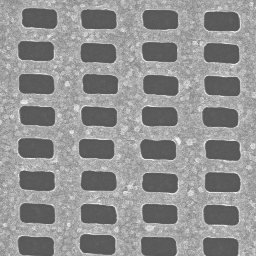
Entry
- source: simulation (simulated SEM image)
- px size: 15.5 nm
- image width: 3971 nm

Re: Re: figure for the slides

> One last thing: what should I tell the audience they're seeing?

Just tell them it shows a regular array of holes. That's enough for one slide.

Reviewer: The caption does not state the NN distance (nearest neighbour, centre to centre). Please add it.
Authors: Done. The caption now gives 0.496 µm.